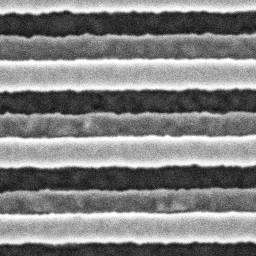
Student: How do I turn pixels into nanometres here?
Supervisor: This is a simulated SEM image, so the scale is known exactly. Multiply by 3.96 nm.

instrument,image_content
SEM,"lines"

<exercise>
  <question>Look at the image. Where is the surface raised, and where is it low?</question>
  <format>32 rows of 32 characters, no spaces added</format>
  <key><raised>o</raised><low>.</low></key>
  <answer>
oooooooooooooooooooooooooooooooo
o.oooo...ooo.......o.......oo...
................................
................................
o.........oo.ooo..o.oooooooooooo
oooooooooooooooooooooooooooooooo
oooooooooooooooooooooooooooooooo
oooooooooooooooooooooooooooooooo
oooooooooooooooooooooooooooooooo
oooooooooooooooooooooooooooooooo
oooooooooooooooooooooooooooooooo
................................
................................
................................
oooooooooooooooooooooooooooooooo
oooooooooooooooooooooooooooooooo
oooooooooooooooooooooooooooooooo
oooooooooooooooooooooooooooooooo
oooooooooooooooooooooooooooooooo
oooooooooooooooooooooooooooooooo
oooooooooooooooooooooooooooooooo
................................
................................
................................
oooooooooooooooooooooooooooooooo
oooooooooooooooooooooooooooooooo
oooooooooooooooooooooooooooooooo
oooooooooooooooooooooooooooooooo
oooooooooooooooooooooooooooooooo
oooooooooooooooooooooooooooooooo
................................
................................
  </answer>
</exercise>